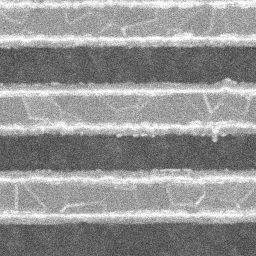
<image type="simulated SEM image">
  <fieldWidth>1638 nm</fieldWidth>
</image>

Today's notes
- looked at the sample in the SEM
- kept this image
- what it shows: one or a few lines or trenches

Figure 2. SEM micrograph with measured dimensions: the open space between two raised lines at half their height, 0.336 microns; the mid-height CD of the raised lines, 226 nm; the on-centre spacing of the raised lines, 563 nm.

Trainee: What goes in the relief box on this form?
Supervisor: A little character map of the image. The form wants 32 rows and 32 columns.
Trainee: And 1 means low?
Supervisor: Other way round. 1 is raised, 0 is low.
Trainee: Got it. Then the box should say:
00010000101111111111111111011111
11111111111111111111111111111111
11111111111111111111111111111111
11111111111111111111111111111111
11111111111111111111111111111111
00000000000000000000000000000000
00000000000000000000000000000000
00000000000000000000000000000000
00000000000000000000000000000000
00000000000000000000000000000000
00000000000000000000000000000000
00000000011011111111110111111111
11111111111111111111111111111111
11111111111111111111111111111111
11111111111111111111111111111111
11111111111111111111111111111111
00000000000000000000000000000000
00000000000000000000000000000000
00000000000000000000000000000000
00000000000000000000000000000000
00000000000000000000000000000000
00000000000000000000000000000000
00111111111111101001111101111111
11111111111111111111111111111111
11111111111111111111111111111111
11111111111111111111111111111111
11111111111111111111111111111111
00000000000000000000000000000000
00000000000000000000000000000000
00000000000000000000000000000000
00000000000000000000000000000000
00000000000000000000000000000000